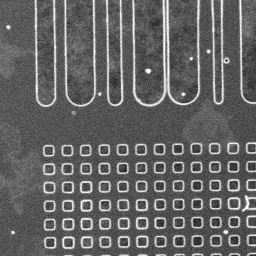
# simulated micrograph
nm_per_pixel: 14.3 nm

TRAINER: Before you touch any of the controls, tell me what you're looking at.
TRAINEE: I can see groups of lines, slits or small figures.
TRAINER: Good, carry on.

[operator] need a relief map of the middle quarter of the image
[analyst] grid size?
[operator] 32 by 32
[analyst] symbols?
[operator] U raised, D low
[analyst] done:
DDDDDDDDUUUDDDUUUDDDDDDDDUDDDDDD
DDDDDDDDUUUDDDUUUDDDDDDDDUDDDDDD
UDDDDDDDUUUDDDUUUDDDDDDDDUDDDDDD
UDDDDDDDUUUDDDUUUDDDDDDDDUDDDDDD
UDDDDDDDUUUDDDUUUDDDDDDDDUDDDDDD
UDDDDDDDUUUDDDDUUDDDDDDDDUDDDDDD
UDDDDDDDUUUDDDDUUDDDDDDDDUDDDDDD
UDDDDDDDUUUDDDDUUUDDDDDDDUDDDDDD
UDDDDDDUUUUDDDDUUUDDDDDDDUUDDDDD
UUDDDDUUUUUDDDUUUUUDDDDDUUUUDDDD
UUUUUUUUUUUUUUUUUUUUUUUUUUUUUUUU
UUUUUUUUUUUUUUUUUUUUUUUUUUUUUUUU
UUUUUUUUUUUUUUUUUUUUUUUUUUUUUUUU
UUUUUUUUUUUUUUUUUUUUUUUUUUUUUUUU
UUUUUUUUUUUUUUUUUUUUUUUUUUUUUUUU
UUUUUUUUUUUUUUUUUUUUUUUUUUUUUUUU
UUUUUUUUUUUUUUUUUUUUUUUUUUUUUUUU
UUUUUUUUUUUUUUUUUUUUUUUUUUUUUUUU
UUUUUUUUUUUUUUUUUUUUUUUUUUUUUUUU
UUUUUUUUUUUUUUUUUUUUUUUUUUUUUUUU
DUUUUDUUUDDUUUDDUUDDUUUDDUUDDDUU
DDUUDDDUUDDUUDDDUUDDUUUDDUUDDDUU
DDUUDDUUUDDUUUDDUUDDUUUDDUUUDUUU
UUUUUUUUUUUUUUUUUUUUUUUUUUUUUUUU
UUUUUUUUUUUUUUUUUUUUUUUUUUUUUUUU
DDUUDDDUUDDUUDDDUUDDUUUDDUUDDDUU
DDUUDDDUUDDUUDDDUUDDUUUDDUUDDDUU
DUUUUUUUUUUUUUUUUUUUUUUUUUUUUUUU
UUUUUUUUUUUUUUUUUUUUUUUUUUUUUUUU
UUUUUDUUUUDUUUDUUUUDUUUDDUUUDDUU
DDUUDDDUUDDUUDDDUUDDDUUDDUUDDDUU
DDUUDDDUUDDUUUDDUUDDUUUDDUUUDDUU